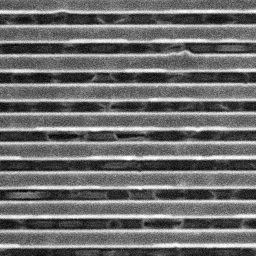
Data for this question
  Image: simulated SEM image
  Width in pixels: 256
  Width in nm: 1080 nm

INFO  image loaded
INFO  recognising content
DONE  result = parallel lines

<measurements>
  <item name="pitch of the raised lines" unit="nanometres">124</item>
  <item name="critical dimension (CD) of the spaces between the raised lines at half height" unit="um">0.0512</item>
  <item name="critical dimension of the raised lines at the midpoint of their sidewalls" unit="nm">71.2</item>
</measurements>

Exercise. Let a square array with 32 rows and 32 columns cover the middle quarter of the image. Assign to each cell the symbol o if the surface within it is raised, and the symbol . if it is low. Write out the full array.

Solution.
oooooooooooooooooooooooooooooooo
oooooooooooooooooooooooooooooooo
................................
................................
................................
oooooooooooooooooooooooooooooooo
oooooooooooooooooooooooooooooooo
oooooooooooooooooooooooooooooooo
oooooooooooooooooooooooooooooooo
................................
................................
................................
oooooooooooooooooooooooooooooooo
oooooooooooooooooooooooooooooooo
oooooooooooooooooooooooooooooooo
oooooooooooooooooooooooooooooooo
......ooo.......................
................................
................................
................................
oooooooooooooooooooooooooooooooo
oooooooooooooooooooooooooooooooo
oooooooooooooooooooooooooooooooo
oooooooooooooooooooooooooooooooo
................................
................................
................................
oooooooooooooooooooooooooooooooo
oooooooooooooooooooooooooooooooo
oooooooooooooooooooooooooooooooo
oooooooooooooooooooooooooooooooo
................................